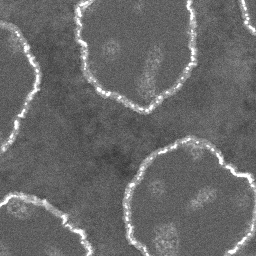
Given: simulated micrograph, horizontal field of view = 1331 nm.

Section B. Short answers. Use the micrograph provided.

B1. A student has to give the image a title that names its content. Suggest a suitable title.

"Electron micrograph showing raised bodies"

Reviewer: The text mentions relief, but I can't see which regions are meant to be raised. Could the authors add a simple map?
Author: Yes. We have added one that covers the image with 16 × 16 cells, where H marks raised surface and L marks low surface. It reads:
LLLLLHHHHHHHLLLH
LLLLLHHHHHHHLLLH
HLLLLHHHHHHHLLLL
HHLLLHHHHHHHLLLL
HHLLLHHHHHHHLLLL
HHLLLLHHHHHLLLLL
HHLLLLLLHHLLLLLL
HLLLLLLLLLLLLLLL
HLLLLLLLLLLLLLLL
LLLLLLLLLLHHHHLL
LLLLLLLLLHHHHHLL
LLLLLLLLHHHHHHHH
HHLLLLLLHHHHHHHH
HHHHLLLLHHHHHHHH
HHHHHLLLHHHHHHHH
HHHHHHLLLHHHHHHL